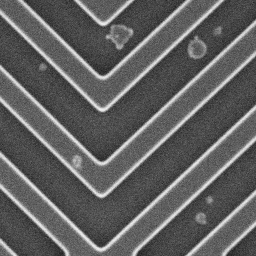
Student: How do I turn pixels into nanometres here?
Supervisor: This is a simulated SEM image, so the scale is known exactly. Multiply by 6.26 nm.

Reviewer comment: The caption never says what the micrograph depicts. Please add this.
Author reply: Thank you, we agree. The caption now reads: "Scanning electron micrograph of groups of lines, slits or small figures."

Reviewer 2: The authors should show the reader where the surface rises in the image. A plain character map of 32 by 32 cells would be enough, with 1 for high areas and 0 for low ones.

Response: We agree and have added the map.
11100000001111110000000111100000
11110000000111100000001111000000
01111000000011000000011110000000
00111100000000000000111100000001
00011110000000000001111000000011
00001111000000000011110000000111
00000111100000000111100000001111
00000011110000001111000000011110
00000001111000111110000000111100
10000000111101111100000001111000
11000000011111111000000011110000
11100000001111110000000111100000
11110000000111100000001111000000
01111000000011000000111110000000
00111100000000000001111100000001
00011110000000000011111000000011
00001111000000000111110000000111
00000111100000001111100000001111
00000011110000011111000000111110
00000001111000111100000001111100
10000000111111111000000011111000
11000000011111110000000111110000
11100000001111100000001111100000
11110000000111000000011111000000
01111000000010000000111100000001
00111100000000000001111000000011
00011110000000000011110000000111
00001111100000000111100000001111
00000111110000001111000000011111
00000011111000011110000000111100
10000001111100111100000001111000
11000000111111111000000011110000